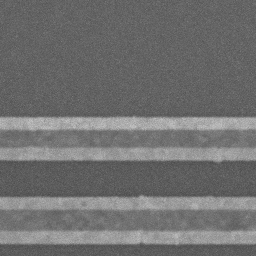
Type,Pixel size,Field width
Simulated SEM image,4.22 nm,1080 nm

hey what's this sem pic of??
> one or a few lines or trenches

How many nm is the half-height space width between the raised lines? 205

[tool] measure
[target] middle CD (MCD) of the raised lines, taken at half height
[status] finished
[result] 0.14 microns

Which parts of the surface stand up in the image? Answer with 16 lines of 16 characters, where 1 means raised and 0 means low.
0000000000000000
0000000000000000
0000000000000000
0000000000000000
0000000000000000
0000000000000000
0000000000000000
0000000000000000
1111111111111111
1111111111111111
0000000000000000
0000000000000000
0000000000000000
1111111111111111
1111111111111111
0000000000000000